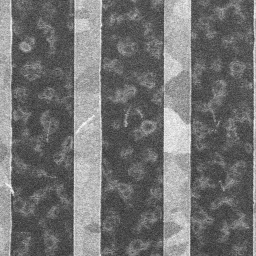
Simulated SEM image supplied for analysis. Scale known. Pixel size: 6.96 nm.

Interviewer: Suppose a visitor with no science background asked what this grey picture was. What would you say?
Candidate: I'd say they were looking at one or a few lines or trenches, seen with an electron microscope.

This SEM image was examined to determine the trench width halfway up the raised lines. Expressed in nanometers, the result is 444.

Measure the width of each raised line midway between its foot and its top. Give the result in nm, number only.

186